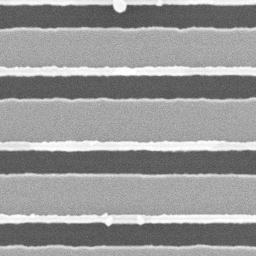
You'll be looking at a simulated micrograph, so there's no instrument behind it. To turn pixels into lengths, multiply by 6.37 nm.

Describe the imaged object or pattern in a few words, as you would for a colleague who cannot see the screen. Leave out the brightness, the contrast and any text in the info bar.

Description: lines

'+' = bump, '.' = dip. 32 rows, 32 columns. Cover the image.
+++++++++++++++++++++++++.++++++
................................
................................
..+.......+......+++++..++.....+
++++++++++++++++++++++++++++++++
++++++++++++++++++++++++++++++++
++++++++++++++++++++++++++++++++
++++++++++++++++++++++++++++++++
++++++++++++++++++++++++++++++++
................................
................................
................................
.+..+++++.+.++..+++++.++++.....+
++++++++++++++++++++++++++++++++
++++++++++++++++++++++++++++++++
++++++++++++++++++++++++++++++++
++++++++++++++++++++++++++++++++
++++++++++++++++++++++++++++++++
++++++++++++++++++++++++++++++++
................................
................................
................................
++++++++++++++++++++++++++++++++
++++++++++++++++++++++++++++++++
++++++++++++++++++++++++++++++++
++++++++++++++++++++++++++++++++
++++++++++++++++++++++++++++++++
++++++++++++++++++++++++++++++++
................................
................................
................................
++++++++++++++++++++++++++++++++